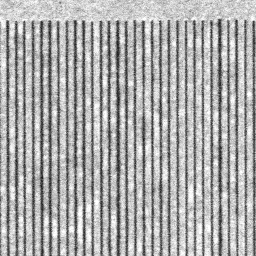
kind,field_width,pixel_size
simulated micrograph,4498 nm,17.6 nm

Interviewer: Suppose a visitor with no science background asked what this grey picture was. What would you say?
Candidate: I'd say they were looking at parallel lines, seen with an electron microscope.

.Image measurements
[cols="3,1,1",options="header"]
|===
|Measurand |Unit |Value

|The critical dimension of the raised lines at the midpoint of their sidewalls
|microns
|0.09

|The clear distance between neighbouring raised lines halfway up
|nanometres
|59.3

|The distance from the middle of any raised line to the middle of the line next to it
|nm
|149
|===